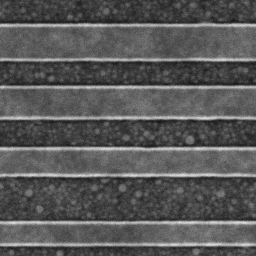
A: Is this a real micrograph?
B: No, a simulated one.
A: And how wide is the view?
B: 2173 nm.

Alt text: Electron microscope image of one or a few lines or trenches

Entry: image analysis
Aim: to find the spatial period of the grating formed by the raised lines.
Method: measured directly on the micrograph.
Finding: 542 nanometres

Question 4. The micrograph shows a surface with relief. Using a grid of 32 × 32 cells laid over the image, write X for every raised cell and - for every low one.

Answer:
--------------------------------
--------------------------------
--------------------------------
XXXXXXXXXXXXXXXXXXXXXXXXXXXXXXXX
XXXXXXXXXXXXXXXXXXXXXXXXXXXXXXXX
XXXXXXXXXXXXXXXXXXXXXXXXXXXXXXXX
XXXXXXXXXXXXXXXXXXXXXXXXXXXXXXXX
--------------------------------
--------------------------------
--------------------------------
--------------------------------
XXXXXXXXXXXXXXXXXXXXXXXXXXXXXXXX
XXXXXXXXXXXXXXXXXXXXXXXXXXXXXXXX
XXXXXXXXXXXXXXXXXXXXXXXXXXXXXXXX
XXXXXXXXXXXXXXXXXXXXXXXXXXXXXXXX
--------------------------------
--------------------------------
--------------------------------
--------------------------------
XXXXXXXXXXXXXXXXXXXXXXXXXXXXXXXX
XXXXXXXXXXXXXXXXXXXXXXXXXXXXXXXX
XXXXXXXXXXXXXXXXXXXXXXXXXXXXXXXX
--------------------------------
--------------------------------
--------------------------------
--------------------------------
--------------------------------
--------------------------------
XXXXXXXXXXXXXXXXXXXXXXXXXXXXXXXX
XXXXXXXXXXXXXXXXXXXXXXXXXXXXXXXX
XXXXXXXXXXXXXXXXXXXXXXXXXXXXXXXX
--------------------------------